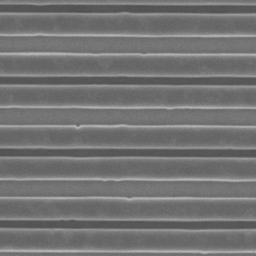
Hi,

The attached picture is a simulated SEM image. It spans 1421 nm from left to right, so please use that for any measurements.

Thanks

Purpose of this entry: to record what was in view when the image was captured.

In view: parallel lines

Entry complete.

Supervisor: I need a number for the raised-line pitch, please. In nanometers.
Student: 200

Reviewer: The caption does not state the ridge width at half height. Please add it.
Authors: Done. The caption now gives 124 nm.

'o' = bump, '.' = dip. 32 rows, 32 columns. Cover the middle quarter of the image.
oooooooooooooooooooooooooooooooo
oooooooooooooooooooooooooooooooo
oooooooooooooooooooooooooooooooo
................................
................................
ooooooooooooooooooooooooooooooo.
oooooooooooooooooooooooooooooooo
oooooooooooooooooooooooooooooooo
oooooooooooooooooooooooooooooooo
oooooooooooooooooooooooooooooooo
oooooooooooooooooooooooooooooooo
................................
................................
................................
................................
.oo.oooo....oooo.........oooo...
oooooooooooooooooooooooooooooooo
oooooooooooooooooooooooooooooooo
oooooooooooooooooooooooooooooooo
oooooooooooooooooooooooooooooooo
oooooooooooooooooooooooooooooooo
................................
................................
oo.....ooooooooooooooooooooooooo
oooooooooooooooooooooooooooooooo
oooooooooooooooooooooooooooooooo
oooooooooooooooooooooooooooooooo
oooooooooooooooooooooooooooooooo
oooooooooooooooooooooooooooooooo
................................
................................
................................